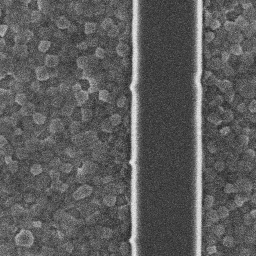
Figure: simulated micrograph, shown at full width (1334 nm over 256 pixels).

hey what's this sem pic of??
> one or a few lines or trenches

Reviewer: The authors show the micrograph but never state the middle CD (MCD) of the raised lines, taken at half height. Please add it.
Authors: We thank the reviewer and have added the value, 346 nanometers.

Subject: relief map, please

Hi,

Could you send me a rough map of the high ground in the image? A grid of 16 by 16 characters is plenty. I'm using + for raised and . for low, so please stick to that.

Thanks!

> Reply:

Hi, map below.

........++++....
........++++....
........++++....
........++++....
........++++....
........++++....
........++++....
........++++....
........++++....
........+++++...
........++++....
........++++....
........++++....
........++++....
........++++....
........++++....